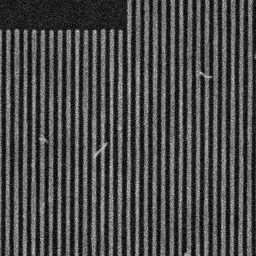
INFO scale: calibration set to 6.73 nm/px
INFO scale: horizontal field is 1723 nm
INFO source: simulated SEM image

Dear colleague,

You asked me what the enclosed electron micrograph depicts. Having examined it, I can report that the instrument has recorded parallel lines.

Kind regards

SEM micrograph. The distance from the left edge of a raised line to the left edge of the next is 58.1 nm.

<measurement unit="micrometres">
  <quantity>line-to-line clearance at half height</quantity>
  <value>0.0362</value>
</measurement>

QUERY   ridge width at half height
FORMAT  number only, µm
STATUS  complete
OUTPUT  0.0244